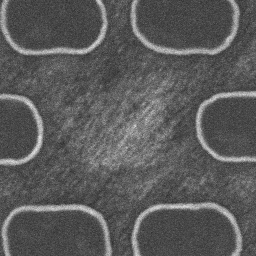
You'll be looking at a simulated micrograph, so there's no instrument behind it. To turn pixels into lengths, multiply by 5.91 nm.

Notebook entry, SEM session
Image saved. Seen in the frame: raised bodies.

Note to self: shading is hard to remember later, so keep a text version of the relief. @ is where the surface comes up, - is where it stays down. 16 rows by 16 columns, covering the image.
@@@@@@--@@@@@@@-
@@@@@@@-@@@@@@@-
-@@@@@---@@@@@--
----------------
----------------
----------------
@@-----------@@@
@@----------@@@@
@@@----------@@@
@@-----------@@@
----------------
----------------
----------------
-@@@@@---@@@@@--
@@@@@@@-@@@@@@@-
@@@@@@@-@@@@@@@-